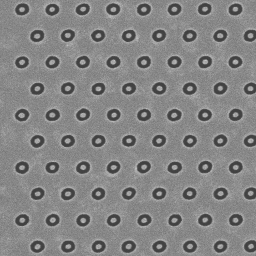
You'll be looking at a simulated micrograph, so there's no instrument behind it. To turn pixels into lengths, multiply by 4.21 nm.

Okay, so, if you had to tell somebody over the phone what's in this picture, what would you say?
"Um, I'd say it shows a regular array of ring-shaped grooves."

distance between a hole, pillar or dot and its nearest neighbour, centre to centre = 0.127 um